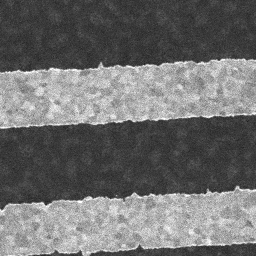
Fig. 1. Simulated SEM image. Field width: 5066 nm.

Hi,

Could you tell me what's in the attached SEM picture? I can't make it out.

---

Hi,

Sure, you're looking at one or a few lines or trenches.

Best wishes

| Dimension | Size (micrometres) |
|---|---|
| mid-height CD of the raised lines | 1.06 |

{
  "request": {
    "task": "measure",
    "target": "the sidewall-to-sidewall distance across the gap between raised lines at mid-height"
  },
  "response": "1510 nm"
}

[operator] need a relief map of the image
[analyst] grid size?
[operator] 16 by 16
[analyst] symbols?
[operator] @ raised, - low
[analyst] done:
----------------
----------------
----------------
----------------
--@@@@@@@@@@@@@@
@@@@@@@@@@@@@@@@
@@@@@@@@@@@@@@@@
@@@@@@@@@-------
----------------
----------------
----------------
----------------
-----@@@@@@@@@@@
@@@@@@@@@@@@@@@@
@@@@@@@@@@@@@@@@
@@@@@@@@-@------